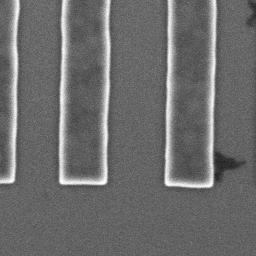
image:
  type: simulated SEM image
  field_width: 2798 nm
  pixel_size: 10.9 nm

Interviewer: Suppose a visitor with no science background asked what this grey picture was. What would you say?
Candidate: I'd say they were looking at wiring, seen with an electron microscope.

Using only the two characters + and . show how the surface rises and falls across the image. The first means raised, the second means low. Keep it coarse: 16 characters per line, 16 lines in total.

+...+++....++...
+...+++....++...
+...+++....++...
+...+++....++...
+...+++...+++...
+...+++...+++...
+...+++...+++...
+...+++...+++...
+...+++...+++...
+...+++...+++...
+...+++...+++...
...........++...
................
................
................
................